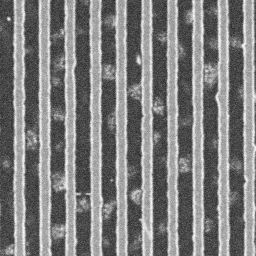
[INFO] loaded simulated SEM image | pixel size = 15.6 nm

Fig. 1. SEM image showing parallel lines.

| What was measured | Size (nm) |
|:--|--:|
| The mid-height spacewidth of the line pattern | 267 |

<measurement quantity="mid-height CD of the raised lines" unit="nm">135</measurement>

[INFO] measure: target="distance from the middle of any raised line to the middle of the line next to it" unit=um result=0.398